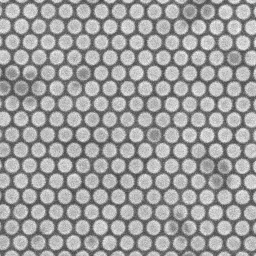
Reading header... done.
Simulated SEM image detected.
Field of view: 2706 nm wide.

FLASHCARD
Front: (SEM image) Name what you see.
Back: a regular array of raised bodies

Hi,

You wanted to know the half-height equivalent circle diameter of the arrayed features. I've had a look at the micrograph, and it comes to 145 nm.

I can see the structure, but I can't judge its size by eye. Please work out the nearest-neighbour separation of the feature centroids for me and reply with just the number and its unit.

186 nanometres